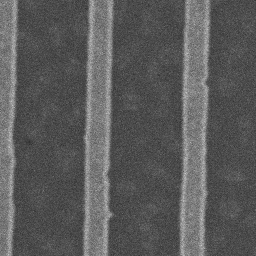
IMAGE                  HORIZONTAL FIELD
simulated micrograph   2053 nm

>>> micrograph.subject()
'one or a few lines or trenches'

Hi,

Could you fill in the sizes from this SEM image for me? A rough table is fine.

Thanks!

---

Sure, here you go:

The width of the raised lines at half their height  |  155 nanometers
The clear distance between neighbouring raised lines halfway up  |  614 nanometers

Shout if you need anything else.